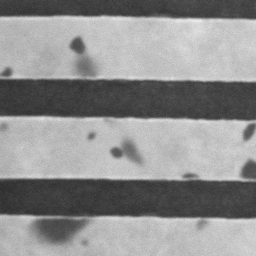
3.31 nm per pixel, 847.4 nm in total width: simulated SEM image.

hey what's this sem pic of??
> lines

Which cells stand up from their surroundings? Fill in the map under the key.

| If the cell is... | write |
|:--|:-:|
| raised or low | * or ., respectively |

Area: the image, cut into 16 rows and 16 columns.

................
****************
****************
****************
****************
................
................
***************.
****************
****************
****************
................
................
***.............
****************
****************